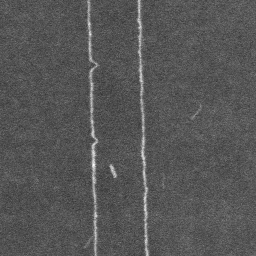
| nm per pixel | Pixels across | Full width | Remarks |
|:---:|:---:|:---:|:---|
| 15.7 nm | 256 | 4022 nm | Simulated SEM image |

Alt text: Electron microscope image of one or a few lines or trenches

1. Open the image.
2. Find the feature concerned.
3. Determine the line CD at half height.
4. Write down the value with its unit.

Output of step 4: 793 nm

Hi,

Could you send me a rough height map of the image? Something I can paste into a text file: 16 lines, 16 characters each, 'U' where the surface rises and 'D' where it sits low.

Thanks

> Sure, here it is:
DDDDDDUUUDDDDDDD
DDDDDDUUUDDDDDDD
DDDDDDUUUDDDDDDD
DDDDDDUUUDDDDDDD
DDDDDDUUUDDDDDDD
DDDDDDUUUDDDDDDD
DDDDDDUUUDDDDDDD
DDDDDDUUUDDDDDDD
DDDDDDUUUDDDDDDD
DDDDDDUUUDDDDDDD
DDDDDDUUUDDDDDDD
DDDDDDUUUDDDDDDD
DDDDDDUUUDDDDDDD
DDDDDDUUUDDDDDDD
DDDDDDUUUDDDDDDD
DDDDDDUUUDDDDDDD